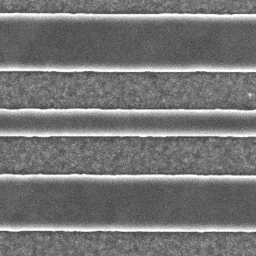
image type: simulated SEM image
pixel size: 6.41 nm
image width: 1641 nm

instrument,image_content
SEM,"lines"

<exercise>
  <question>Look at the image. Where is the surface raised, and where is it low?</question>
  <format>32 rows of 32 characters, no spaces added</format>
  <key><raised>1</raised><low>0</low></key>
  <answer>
00000000000000000000000000000000
00000000000000000000000000000000
11111111111111111111111111111111
11111111111111111111111111111111
11111111111111111111111111111111
11111111111111111111111111111111
11111111111111111111111111111111
11111111111111111111111111111111
11111111111111111111111111111111
00000000000000000000000000000000
00000000000000000000000000000000
00000000000000000000000000000000
00000000000000000000000000000000
00000000000000000000000000000000
11111111111111111111111111111111
11111111111111111111111111111111
11111111111111111111111111111111
00000000000000000000000000000000
00000000000000000000000000000000
00000000000000000000000000000000
00000000000000000000000000000000
00000000000000000000000000000000
11111111111111111111111111111111
11111111111111111111111111111111
11111111111111111111111111111111
11111111111111111111111111111111
11111111111111111111111111111111
11111111111111111111111111111111
11111111111111111111111111111111
00000000000000000000000000000000
00000000000000000000000000000000
00000000000000000000000000000000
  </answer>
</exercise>